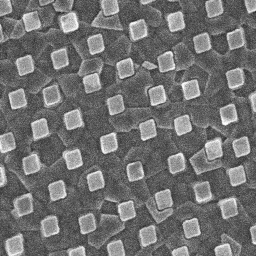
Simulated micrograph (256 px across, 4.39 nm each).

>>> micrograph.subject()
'a regular array of raised bodies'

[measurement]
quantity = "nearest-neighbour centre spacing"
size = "18.2 pixels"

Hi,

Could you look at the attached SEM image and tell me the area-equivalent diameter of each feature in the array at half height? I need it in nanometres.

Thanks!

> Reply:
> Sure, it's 79.6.